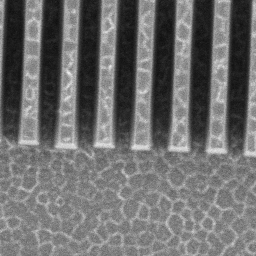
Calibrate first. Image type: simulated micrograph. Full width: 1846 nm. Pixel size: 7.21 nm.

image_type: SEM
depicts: parallel lines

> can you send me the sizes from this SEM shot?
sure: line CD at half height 127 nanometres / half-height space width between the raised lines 141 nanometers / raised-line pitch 272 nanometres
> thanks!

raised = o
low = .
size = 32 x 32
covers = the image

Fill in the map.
o..oo...oo...oo..ooo..oo...oo...
o..oo...oo...oo..oo...oo...oo..o
o..oo...oo...oo..oo...oo...oo..o
o..oo...oo...oo..oo...oo...oo..o
...oo...oo..ooo..oo...oo...oo..o
...oo...oo..ooo..oo...oo...oo..o
...oo...oo..ooo..oo...oo..ooo..o
...oo...oo..oo...oo...oo..ooo..o
...oo...oo..oo...oo...oo..ooo..o
...oo...oo..oo...oo...oo..oo...o
...oo...oo..oo...oo...oo..oo...o
...oo...oo..oo...oo...oo..oo...o
...oo..ooo..oo...oo...oo..oo...o
...oo..ooo..oo...oo...oo..oo...o
...oo..ooo..oo...oo...oo..oo...o
...oo..oo...oo...oo..ooo..oo...o
...oo..oo...oo...oo..ooo..oo...o
...oo..oo...oo...oo..ooo..oo...o
......................o...oo...o
................................
................................
................................
................................
................................
................................
................................
................................
................................
................................
................................
................................
................................